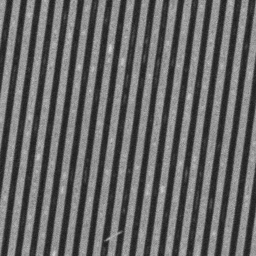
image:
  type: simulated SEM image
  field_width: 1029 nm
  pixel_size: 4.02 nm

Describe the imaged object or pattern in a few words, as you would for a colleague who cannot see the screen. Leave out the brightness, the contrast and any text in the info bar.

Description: parallel lines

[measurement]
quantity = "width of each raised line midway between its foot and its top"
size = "30.3 nanometers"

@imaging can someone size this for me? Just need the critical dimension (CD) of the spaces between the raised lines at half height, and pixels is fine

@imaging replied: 6.69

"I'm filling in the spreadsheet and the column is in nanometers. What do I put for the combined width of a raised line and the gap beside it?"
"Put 56.9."